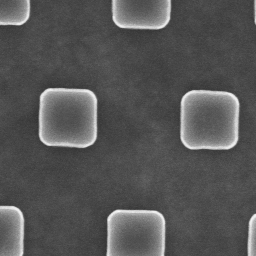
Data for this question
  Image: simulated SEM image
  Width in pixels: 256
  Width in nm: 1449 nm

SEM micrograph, raised bodies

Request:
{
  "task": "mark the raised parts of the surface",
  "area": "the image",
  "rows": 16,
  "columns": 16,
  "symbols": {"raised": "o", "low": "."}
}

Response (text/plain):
oo.....oooo.....
.......ooo......
................
................
................
................
...ooo.....oooo.
...ooo.....oooo.
...ooo.....oooo.
................
................
................
................
o......ooo......
o......ooo......
o......ooo......